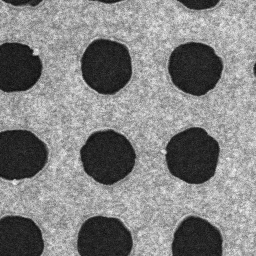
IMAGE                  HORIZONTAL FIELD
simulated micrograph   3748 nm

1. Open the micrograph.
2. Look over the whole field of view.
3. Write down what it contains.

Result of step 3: holes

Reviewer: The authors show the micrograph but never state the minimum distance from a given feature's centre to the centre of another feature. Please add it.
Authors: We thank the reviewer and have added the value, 1.26 micrometres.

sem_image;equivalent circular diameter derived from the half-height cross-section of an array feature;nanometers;795